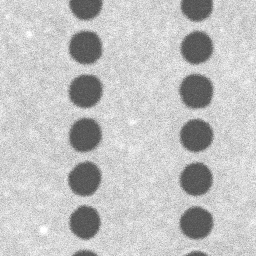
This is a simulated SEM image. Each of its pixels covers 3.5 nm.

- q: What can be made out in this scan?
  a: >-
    a regular array of holes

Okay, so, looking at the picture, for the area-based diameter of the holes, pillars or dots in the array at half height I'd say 121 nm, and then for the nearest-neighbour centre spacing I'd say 152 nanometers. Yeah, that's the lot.